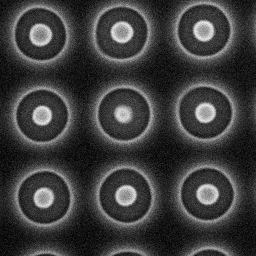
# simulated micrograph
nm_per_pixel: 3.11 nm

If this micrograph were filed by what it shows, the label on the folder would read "an array of small figures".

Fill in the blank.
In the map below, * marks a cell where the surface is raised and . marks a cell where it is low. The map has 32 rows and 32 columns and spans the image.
*************************.******
***....******....******.....****
**......****......****.......***
**..**..****..**..****..***..***
**..**..****..**..****...*...***
**..**..****......*****.....****
***.....*****.....******...*****
****..**************************
********************************
********************************
********************************
****...*******...******.....****
***.....*****.....*****......***
**...*..****...*...***...**..***
**..**...***...*...***...**..***
**...*..****.......****......***
***.....*****.....*****.....****
****...*******..****************
********************************
********************************
********************************
*****..*******...*******....****
***.....*****.....*****......***
**.......****..*...****..**..***
**..***..***...**..****..**..***
**...*...****..*...****......***
***.....*****.....*****.....****
****...*******...********..*****
********************************
********************************
********************************
***************..********...****